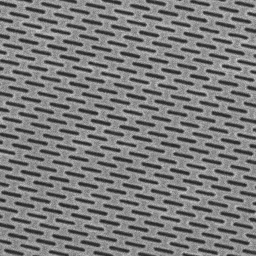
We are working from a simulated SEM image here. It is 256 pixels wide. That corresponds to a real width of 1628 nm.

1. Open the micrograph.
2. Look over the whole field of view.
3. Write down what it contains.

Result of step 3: a regular array of holes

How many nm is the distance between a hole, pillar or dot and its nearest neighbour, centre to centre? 102